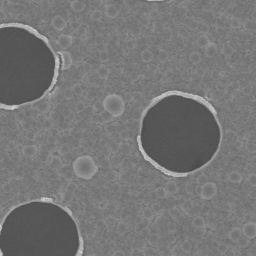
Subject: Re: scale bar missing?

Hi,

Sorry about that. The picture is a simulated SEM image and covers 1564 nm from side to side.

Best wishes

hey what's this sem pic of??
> holes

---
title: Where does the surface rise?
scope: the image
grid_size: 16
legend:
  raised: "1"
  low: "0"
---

1111111111111111
1111111111111111
0001111111111111
0001111111111111
0001111111111111
0001111111111111
0111111111000111
1111111110000011
1111111110000011
1111111110000011
1111111111001111
1111111111111111
1111111111111111
0000111111111111
0000011111111111
0000011111111111